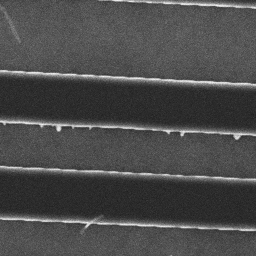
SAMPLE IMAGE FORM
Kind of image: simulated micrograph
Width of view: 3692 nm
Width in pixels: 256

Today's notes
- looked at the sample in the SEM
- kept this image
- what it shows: lines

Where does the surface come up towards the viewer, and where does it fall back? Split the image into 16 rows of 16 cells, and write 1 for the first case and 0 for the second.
0000000000000000
0000000000000000
0000000000000000
0000000000000000
1100000000000000
1111111111111111
1111111111111111
1111111111111111
0000000000000000
0000000000000000
1000000000000000
1111111111111111
1111111111111111
1111111111111111
0000000000000000
0000000000000000